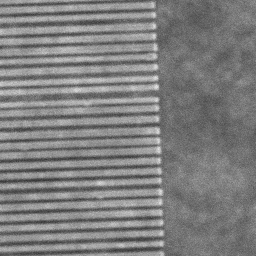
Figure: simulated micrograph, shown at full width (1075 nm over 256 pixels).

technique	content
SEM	parallel lines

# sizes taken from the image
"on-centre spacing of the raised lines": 43.6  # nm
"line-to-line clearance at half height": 19.4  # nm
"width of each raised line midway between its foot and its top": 5.5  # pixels